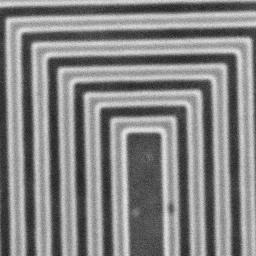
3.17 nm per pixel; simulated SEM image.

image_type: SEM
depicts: groups of lines, slits or small figures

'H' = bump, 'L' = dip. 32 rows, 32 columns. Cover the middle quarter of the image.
LLLLLLLLLLLLLLLLLLLLLLLLLLLLHHHH
HHHHHHHHHHHHHHHHHHHHHHHHHHHHHHHH
HHHHHHHHHHHHHHHHHHHHHHHHHHHHHHHH
HHHHHHHHHHHHHHHHHHHHHHHHHHHHHHHH
HHHLLLLLLLLLLLLLLLLLLLLLLLLLLLLL
HHLLLLLLLLLLLLLLLLLLLLLLLLLLLLLL
HHLLLLLLLLLLLLLLLLLLLLLLLLLLLLLL
HHLLLLHHHHHHHHHHHHHHHHHHHHHHHHHH
HHLLLHHHHHHHHHHHHHHHHHHHHHHHHHHH
HHLLLHHHHHHHHHHHHHHHHHHHHHHHHHHH
HHLLLHHHHHLLLLLLLLLLLLLLLLLLLLLH
HHLLLHHHHLLLLLLLLLLLLLLLLLLLLLLH
HHLLLHHHHLLLLLLLLLLLLLLLLLLLLLLH
HHLLLHHHHLLLLLLLLLLLLLLLHHHLLLLH
HHLLLHHHHLLLHHHHHHHHHHHHHHHHLLLH
HHLLLHHHHLLLHHHHHHHHHHHHHHHHLLLH
HHLLLLHHHLLLHHHHHHHHHHHHHHHHLLLH
HHLLLLHHHLLLHHHLLLLLLLLLLHHHLLLH
HHLLLLHHHLLLHHHLLLLLLLLLLHHHLLLH
HHLLLLHHHLLLHHHLLLLLLLLLLHHHLLLH
HHLLLLHHHLLLHHHLLLLLLLLLLHHHLLLH
HHLLLLHHHLLLHHHLLLLLLLLLLHHHLLLH
HHLLLLHHHLLLHHHLLLLLLLLLLHHHLLLH
HHLLLLHHHLLLHHHLLLLLLLLLLHHHLLLL
HHLLLLHHHLLLHHHLLLLLLLLLLHHHLLLL
HHLLLLHHHLLLHHHLLLLLLLLLLHHHLLLL
HHLLLLHHHLLLHHHLLLLLLLLLLHHHLLLL
HHLLLLHHHLLLHHHLLLLLLLLLLHHHLLLL
HHLLLLHHHLLLHHHLLLLLLLLLLHHHLLLL
HHLLLLHHHLLLHHHLLLLLLLLLLHHHLLLL
HHLLLLHHHLLLHHHLLLLLLLLLLHHHLLLL
HHHLLLHHHLLLHHHHLLLLLLLLLHHHLLLL